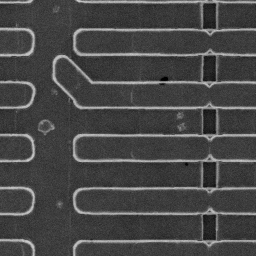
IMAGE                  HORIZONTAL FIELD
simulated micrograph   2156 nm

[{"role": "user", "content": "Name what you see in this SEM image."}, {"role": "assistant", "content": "wiring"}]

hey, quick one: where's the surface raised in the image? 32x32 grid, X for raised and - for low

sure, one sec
--------------------------------
--------------------------------
--------------------------------
--------------------------------
XXXX-----XXXXXXXXXXXXXXXXXXXXXXX
XXXX-----XXXXXXXXXXXXXXXXXXXXXXX
XXXX------XXXXXXXXXXXXXXXXXXXXXX
-------XX-----------------------
-------XXX----------------------
-------XXXX---------------------
XXXX---XXXXXXXXXXXXXXXXXXXXXXXXX
XXXX----XXXXXXXXXXXXXXXXXXXXXXXX
XXXX-----XXXXXXXXXXXXXXXXXXXXXXX
XXX-------------XXXXXXXXX--XXXXX
--------------------------------
--------------------------------
--------------------------------
XXXX-----XXXXXXXXXXXXXXXXXXXXXXX
XXXX-----XXXXXXXXXXXXXXXXXXXXXXX
XXXX-----XXXXXXXXXXXXXXXXXXXXXXX
--------------------------------
--------------------------------
--------------------------------
XXX------------------XXXX-------
XXXX-----XXXXXXXXXXXXXXXXXXXXXXX
XXXX-----XXXXXXXXXXXXXXXXXXXXXXX
XXXX------XXXXXXXXXXXXXXXX-XXXXX
--------------------------------
--------------------------------
--------------------------------
XXXX------XXXXXXXXXXXXXXXXXXXXXX
XXXX-----XXXXXXXXXXXXXXXXXXXXXXX